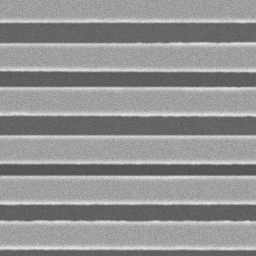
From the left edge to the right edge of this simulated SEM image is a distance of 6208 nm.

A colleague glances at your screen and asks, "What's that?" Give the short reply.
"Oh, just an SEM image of lines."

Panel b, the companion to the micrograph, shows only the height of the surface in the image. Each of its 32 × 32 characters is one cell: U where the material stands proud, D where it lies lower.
UUUUUUUUUUUUUUUUUUUUUUUUUUUUUUUU
UUUUUUUUUUUUUUUUUUUUUUUUUUUUUUUU
UUUUUUUUUUUUUUUUUUUUUUUUUUUUUUUU
DDDDDDDDDDDDDDDDDDDDDDDDDDDDDDDD
DDDDDDDDDDDDDDDDDDDDDDDDDDDDDDDD
UUUUUUUUUUUUUUUUUUUUUUUUUUUUUUUU
UUUUUUUUUUUUUUUUUUUUUUUUUUUUUUUU
UUUUUUUUUUUUUUUUUUUUUUUUUUUUUUUU
UUUUUUUUUUUUUUUUUUUUUUUUUUUUUUUU
DDDDDDDDDDDDDDDDDDDDDDDDDDDDDDDD
DDDDDDDDDDDDDDDDDDDDDDDDDDDDDDDD
UUUUUUUUUUUUUUUUUUUUUUUUUUUUUUUU
UUUUUUUUUUUUUUUUUUUUUUUUUUUUUUUU
UUUUUUUUUUUUUUUUUUUUUUUUUUUUUUUU
DDDDDDDDDDDDDDDDDDDDDDUDDUDDDUUD
DDDDDDDDDDDDDDDDDDDDDDDDDDDDDDDD
DDDDDDDDDDDDDDDDDDDDDDDDDDDDDDDD
UUUUUUUUUUUUUUUUUUUUUUUUUUUUUUUU
UUUUUUUUUUUUUUUUUUUUUUUUUUUUUUUU
UUUUUUUUUUUUUUUUUUUUUUUUUUUUUUUU
DDDDDDDDDDDDDDDDDDDDDDDDDDDDDDDD
DDDDDDDDDDDDDDDDDDDDDDDDDDDDDDDD
UUUUUUUUUUUUUUUUUUUUUUUUUUUUUUUU
UUUUUUUUUUUUUUUUUUUUUUUUUUUUUUUU
UUUUUUUUUUUUUUUUUUUUUUUUUUUUUUUU
UUUUUUUUUUUUUUUUUUUUUUUUUUUUUUUU
DDDDDDDDDDDDDDDDDDDDDDDDDDDDDDDD
DDDDDDDDDDDDDDDDDDDDDDDDDDDDDDDD
UUUUUUUUUUUUUUUUUUUUUUUUUUUUUUUU
UUUUUUUUUUUUUUUUUUUUUUUUUUUUUUUU
UUUUUUUUUUUUUUUUUUUUUUUUUUUUUUUU
DDDDDDDDDDDDDDDDDDDDDDDDDDDDDDDD